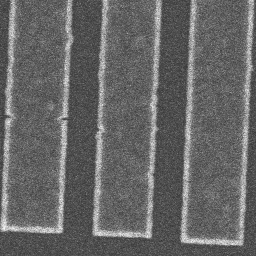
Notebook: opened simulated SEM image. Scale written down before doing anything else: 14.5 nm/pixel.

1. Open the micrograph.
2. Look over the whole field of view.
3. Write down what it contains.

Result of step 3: one or a few lines or trenches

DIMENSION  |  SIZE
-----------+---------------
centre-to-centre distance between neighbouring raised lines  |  1.31 micrometres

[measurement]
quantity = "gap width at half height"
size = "484 nm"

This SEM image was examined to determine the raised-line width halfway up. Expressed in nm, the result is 847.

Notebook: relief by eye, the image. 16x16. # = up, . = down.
.###...###..####
.###..####..####
.###..####..####
.###..####..####
.###..####..####
####..####..####
####..####..###.
####..####..###.
####..####..###.
####..####..###.
####..####..###.
####..####..###.
####..###...###.
####..###..####.
......###..####.
................